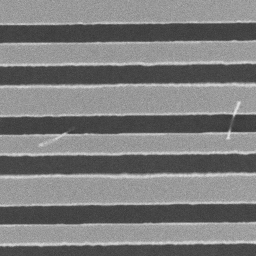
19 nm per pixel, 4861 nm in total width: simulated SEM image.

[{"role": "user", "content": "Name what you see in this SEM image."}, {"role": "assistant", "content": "lines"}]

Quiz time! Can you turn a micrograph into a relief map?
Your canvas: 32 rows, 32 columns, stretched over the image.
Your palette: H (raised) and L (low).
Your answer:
HHHHHHHHHHHHHHHHHHHHHHHHHHHHHHHH
HHHHHHHHHHHHHHHHHHHHHHHHHHHHHHHH
HHHHHHHHHHHHHHHHHHHHHHHHHHHHHHHH
LLLLLLLLLLLLLLLLLLLLLLLLLLLLLLLL
LLLLLLLLLLLLLLLLLLLLLLLLLLLLLLLL
HHHHHHHHHHHHHHHHHHHHHHHHHHHHHHHH
HHHHHHHHHHHHHHHHHHHHHHHHHHHHHHHH
HHHHHHHHHHHHHHHHHHHHHHHHHHHHHHHH
LLLLLLLLLLLLLLLLLLLLLLLLLLLLLLLL
LLLLLLLLLLLLLLLLLLLLLLLLLLLLLLLL
LLLLLLLLLLLLLLLHLHHHHHHHHHHHHHHH
HHHHHHHHHHHHHHHHHHHHHHHHHHHHHHHH
HHHHHHHHHHHHHHHHHHHHHHHHHHHHHHHH
HHHHHHHHHHHHHHHHHHHHHHHHHHHHHHHH
HHHHHHHHLLLLLLLLLLLLLLLLLLLLLLLL
LLLLLLLLLLLLLLLLLLLLLLLLLLLLLLLL
LLLLLLLLLLLLLLLLLLLLLLLLLLLLHLLL
HHHHHHHHHHHHHHHHHHHHHHHHHHHHHHHH
HHHHHHHHHHHHHHHHHHHHHHHHHHHHHHHH
HHHHHHLLLLLLLLLLLLLLLLLLLLLLLLLL
LLLLLLLLLLLLLLLLLLLLLLLLLLLLLLLL
LLLLLLLLLLLLLLLLLLLLLLLLLLLLLLLL
HHHHHHHHHHHHHHHHHHHHHHHHHHHHHHHH
HHHHHHHHHHHHHHHHHHHHHHHHHHHHHHHH
HHHHHHHHHHHHHHHHHHHHHHHHHHHHHHHH
HHHHHHHHHHHHHHHHHHHHHHLHHLLLLLLL
LLLLLLLLLLLLLLLLLLLLLLLLLLLLLLLL
LLLLLLLLLLLLLLLLLLLLLLLLLLLLLLLL
HHHHHHHHHHHHHHHHHHHHHHHHHHHHHHHH
HHHHHHHHHHHHHHHHHHHHHHHHHHHHHHHH
HHHHHHHHHHHHHHHHHHHHHHHHHLLLLLLL
LLLLLLLLLLLLLLLLLLLLLLLLLLLLLLLL